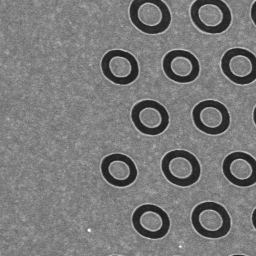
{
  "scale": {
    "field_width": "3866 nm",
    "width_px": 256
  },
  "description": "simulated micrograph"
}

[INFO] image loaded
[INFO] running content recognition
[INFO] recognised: a regular array of ring-shaped grooves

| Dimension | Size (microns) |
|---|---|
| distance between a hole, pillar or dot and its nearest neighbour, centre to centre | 0.898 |